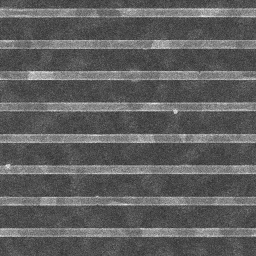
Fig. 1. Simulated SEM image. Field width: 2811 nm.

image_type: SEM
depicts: parallel lines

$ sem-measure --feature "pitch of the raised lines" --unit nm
345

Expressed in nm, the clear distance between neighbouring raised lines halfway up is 257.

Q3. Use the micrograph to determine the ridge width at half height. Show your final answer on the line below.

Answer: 87.8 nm